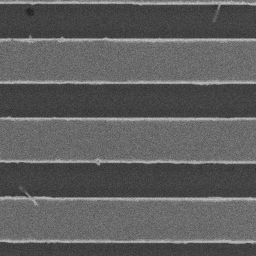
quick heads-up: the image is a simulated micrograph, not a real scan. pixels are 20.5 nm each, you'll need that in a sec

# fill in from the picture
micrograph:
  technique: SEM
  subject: lines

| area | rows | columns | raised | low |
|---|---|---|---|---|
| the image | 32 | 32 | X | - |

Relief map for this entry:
----X------------XXXXXXXXXXXXXXX
--------------------------------
--------------------------------
--------------------------------
--------------------------------
XXXXXXXXXXXXXXXXXXXXXXXXXXXXXXXX
XXXXXXXXXXXXXXXXXXXXXXXXXXXXXXXX
XXXXXXXXXXXXXXXXXXXXXXXXXXXXXXXX
XXXXXXXXXXXXXXXXXXXXXXXXXXXXXXXX
XXXXXXXXXXXXXXXXXXXXXXXXXXXXXXXX
------------------------XXX-----
--------------------------------
--------------------------------
--------------------------------
--------------------------------
XXXXXXXXXXXXXXXXXXXXXXXXXXXXXXXX
XXXXXXXXXXXXXXXXXXXXXXXXXXXXXXXX
XXXXXXXXXXXXXXXXXXXXXXXXXXXXXXXX
XXXXXXXXXXXXXXXXXXXXXXXXXXXXXXXX
XXXXXXXXXXXXXXXXXXXXXXXXXXXXXXXX
--------------------------------
--------------------------------
--------------------------------
--------------------------------
--------------------------------
XXXXXXXXXXXXXXXXXXXXXXXXXXXXXXXX
XXXXXXXXXXXXXXXXXXXXXXXXXXXXXXXX
XXXXXXXXXXXXXXXXXXXXXXXXXXXXXXXX
XXXXXXXXXXXXXXXXXXXXXXXXXXXXXXXX
XXXXXXXXXXXXXXXXXXXXXXXXXXXXXXXX
--------------------------------
--------------------------------